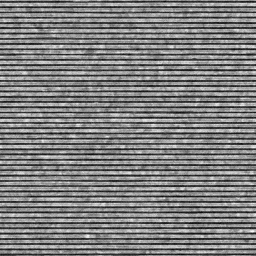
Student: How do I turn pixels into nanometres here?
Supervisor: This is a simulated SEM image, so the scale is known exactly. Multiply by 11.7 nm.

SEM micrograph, parallel lines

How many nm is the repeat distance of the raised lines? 61.7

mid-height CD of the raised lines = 32.2 nanometers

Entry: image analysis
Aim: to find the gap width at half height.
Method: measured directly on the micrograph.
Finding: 32.2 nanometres